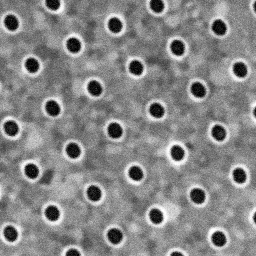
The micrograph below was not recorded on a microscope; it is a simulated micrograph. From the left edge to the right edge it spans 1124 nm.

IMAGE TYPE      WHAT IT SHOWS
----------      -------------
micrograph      a regular array of holes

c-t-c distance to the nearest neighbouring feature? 202 nm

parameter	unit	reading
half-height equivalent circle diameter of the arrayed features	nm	77